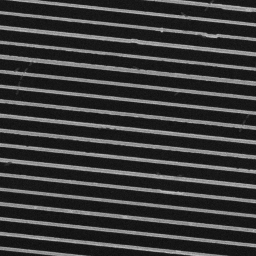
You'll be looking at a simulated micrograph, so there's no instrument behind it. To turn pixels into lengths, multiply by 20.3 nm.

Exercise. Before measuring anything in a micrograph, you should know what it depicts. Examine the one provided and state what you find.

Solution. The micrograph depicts parallel lines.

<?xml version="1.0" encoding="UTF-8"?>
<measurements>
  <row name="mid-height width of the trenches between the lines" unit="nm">230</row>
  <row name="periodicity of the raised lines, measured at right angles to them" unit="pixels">14.6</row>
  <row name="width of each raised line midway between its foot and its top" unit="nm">60.7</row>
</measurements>